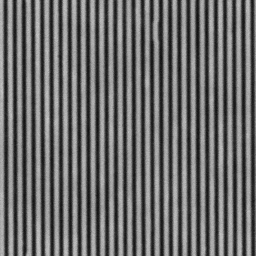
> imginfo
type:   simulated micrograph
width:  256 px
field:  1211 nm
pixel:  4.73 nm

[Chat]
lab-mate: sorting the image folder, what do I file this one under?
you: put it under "parallel lines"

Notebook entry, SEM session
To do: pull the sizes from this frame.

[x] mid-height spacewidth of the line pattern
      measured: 20.1 nanometers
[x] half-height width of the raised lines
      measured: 0.0237 microns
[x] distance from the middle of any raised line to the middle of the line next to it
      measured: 9.13 pixels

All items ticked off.